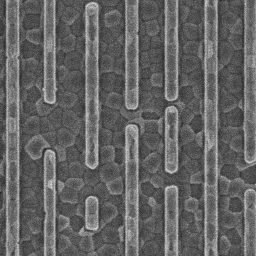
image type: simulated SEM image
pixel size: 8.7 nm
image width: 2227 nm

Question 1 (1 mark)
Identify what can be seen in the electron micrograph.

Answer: parallel lines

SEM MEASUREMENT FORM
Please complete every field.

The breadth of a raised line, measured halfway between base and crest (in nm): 102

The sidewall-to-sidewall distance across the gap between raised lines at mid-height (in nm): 245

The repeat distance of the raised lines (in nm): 345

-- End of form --